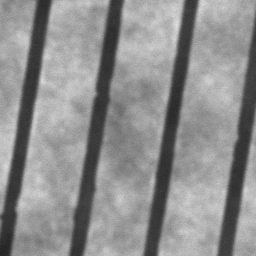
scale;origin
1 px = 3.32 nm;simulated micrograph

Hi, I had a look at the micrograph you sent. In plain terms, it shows one or a few lines or trenches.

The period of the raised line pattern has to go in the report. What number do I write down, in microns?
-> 0.242